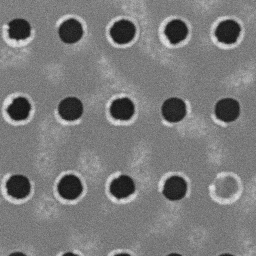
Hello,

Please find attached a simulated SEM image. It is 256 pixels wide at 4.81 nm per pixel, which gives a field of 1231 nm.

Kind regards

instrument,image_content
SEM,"a regular array of holes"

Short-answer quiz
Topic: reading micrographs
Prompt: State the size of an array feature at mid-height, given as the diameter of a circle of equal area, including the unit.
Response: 0.119 µm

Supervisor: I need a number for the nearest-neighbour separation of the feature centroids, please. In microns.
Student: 0.249